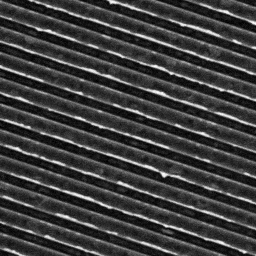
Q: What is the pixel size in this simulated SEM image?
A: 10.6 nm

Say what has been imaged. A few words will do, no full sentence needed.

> parallel lines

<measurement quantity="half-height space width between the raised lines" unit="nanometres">103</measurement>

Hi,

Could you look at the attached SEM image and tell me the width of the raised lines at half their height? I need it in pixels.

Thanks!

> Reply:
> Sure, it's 15.1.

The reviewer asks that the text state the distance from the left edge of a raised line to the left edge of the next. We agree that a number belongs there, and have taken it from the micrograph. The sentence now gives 0.259 micrometres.